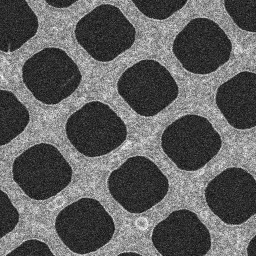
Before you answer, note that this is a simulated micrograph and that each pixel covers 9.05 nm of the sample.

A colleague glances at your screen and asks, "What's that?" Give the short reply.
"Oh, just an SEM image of a regular array of holes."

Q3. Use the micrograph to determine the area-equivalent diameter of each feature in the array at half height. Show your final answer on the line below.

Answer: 0.51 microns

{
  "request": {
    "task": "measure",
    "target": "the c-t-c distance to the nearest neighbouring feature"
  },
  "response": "614 nanometers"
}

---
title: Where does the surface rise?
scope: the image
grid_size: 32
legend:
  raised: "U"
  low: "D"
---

DDDUUUDDDUUUUUUUUDDDDDDUUUUUDDDD
DDDDUUUUUUUDDDDUUUDDDDUUUUUUDDDD
DDDDDUUUUUDDDDDDUUUUUUUUDDUUUDDD
DDDDDUUUUDDDDDDDDUUUUUUDDDDDUUDD
DDDDUUUUUDDDDDDDDUUUUUDDDDDDUUUU
DDDUUUUUUUDDDDDDDUUUUUDDDDDDDUUU
UUUUUDDDUUUDDDDDUUUUUUDDDDDDDUUU
UUUDDDDDDUUUDDUUUUDUUUDDDDDDDUUU
UUUDDDDDDDUUUUUUDDDDDUUDDDDUUUUU
UUUDDDDDDDUUUUUDDDDDDUUUUUUUUDDD
UUUDDDDDDDUUUUUDDDDDDDUUUUUUDDDD
DUUUDDDDDUUUUUUDDDDDDDUUUUUDDDDD
DDUUUDDDUUUUUUUUDDDDDDUUUUUDDDDD
DDDUUUUUUUDDDDUUDDDDDUUUUUUDDDDD
DDDDUUUUUDDDDDDUUUDUUUUDDUUUDDDD
DDDUUUUUDDDDDDDDUUUUUDDDDDUUUDDD
DDDUUUUUDDDDDDDDUUUUDDDDDDDUUUUU
DDUUUUUUUDDDDDDDUUUUDDDDDDDDUUUU
UUUUDDDUUDDDDDDUUUUUDDDDDDDDUUUU
UUDDDDDDUUUDDUUUUDUUUDDDDDDUUUUU
UUDDDDDDDUUUUUUDDDDUUUDDDDUUUUUU
UUDDDDDDDUUUUUDDDDDDUUUUUUUUDDDU
UUDDDDDDDUUUUDDDDDDDDUUUUUDDDDDD
UUUDDDDDUUUUUUDDDDDDDUUUUUDDDDDD
DUUDDDDUUUUUUUDDDDDDDUUUUUDDDDDD
DDUUUUUUUDDDDUUDDDDDUUUUUUDDDDDD
DDUUUUUDDDDDDUUUDDUUUUDDUUUDDDDD
DDUUUUUDDDDDDDUUUUUUDDDDDUUUDDDU
DDUUUUUDDDDDDDUUUUUDDDDDDDUUUUUU
DUUUUUUDDDDDDDUUUUUDDDDDDDUUUUUU
UUUDDDUUDDDDDUUUUUUDDDDDDDUUUUUD
UDDDDDUUUDDDUUUUUUUUDDDDDDUUUUUD